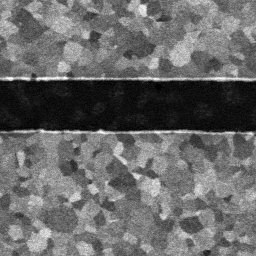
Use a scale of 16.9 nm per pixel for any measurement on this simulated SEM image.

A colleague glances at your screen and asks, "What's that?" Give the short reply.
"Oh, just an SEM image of one or a few lines or trenches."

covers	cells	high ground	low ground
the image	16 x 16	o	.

oooooooooooooooo
oooooooooooooooo
oooooooooooooooo
oooooooooooooooo
oooooooooooooooo
................
................
................
oooooooooooooooo
oooooooooooooooo
oooooooooooooooo
oooooooooooooooo
oooooooooooooooo
oooooooooooooooo
oooooooooooooooo
oooooooooooooooo